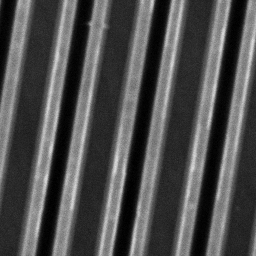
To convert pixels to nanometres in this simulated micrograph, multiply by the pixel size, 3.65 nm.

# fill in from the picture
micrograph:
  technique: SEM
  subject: parallel lines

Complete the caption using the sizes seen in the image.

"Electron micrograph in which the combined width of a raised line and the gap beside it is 136 nanometres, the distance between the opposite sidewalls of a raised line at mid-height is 59.9 nanometres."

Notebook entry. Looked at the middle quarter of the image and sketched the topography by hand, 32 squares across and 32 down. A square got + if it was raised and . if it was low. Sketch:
+....++++.......++++....++++....
+....+++........++++....++++....
+...++++........++++....+++.....
....++++........++++...++++.....
....++++.......+++++...++++.....
....++++.......++++....++++.....
...+++++.......++++....++++.....
...++++........++++....++++.....
...++++........++++....+++......
...++++........++++...++++......
...++++.......+++++...++++......
...++++.......++++....++++......
...++++.......++++....++++......
..++++........++++....++++......
..++++........++++....+++.......
..++++........++++...++++.......
..++++.......+++++...++++.......
..++++.......++++....++++.......
..++++.......++++....++++.......
.++++........++++....++++.......
.++++........++++....+++........
.++++........++++...++++........
.++++........++++...++++........
.++++.......++++....++++.......+
.++++.......++++....++++.......+
++++........++++....++++.......+
++++........++++....+++........+
++++........++++...++++........+
++++........++++...++++........+
++++.......++++....++++........+
++++.......++++....++++........+
+++........++++....++++.......++